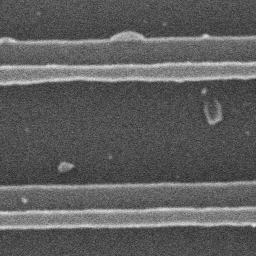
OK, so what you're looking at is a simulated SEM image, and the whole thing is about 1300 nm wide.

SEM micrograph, lines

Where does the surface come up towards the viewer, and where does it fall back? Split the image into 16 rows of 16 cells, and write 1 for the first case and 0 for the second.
0000000000000000
0000000000000000
1000001111111111
1111111111111111
1111111111111111
0000000000000000
0000000000000000
0000000000000000
0000000000000000
0000000000000000
0000000000000000
0000000001111111
1111111111111111
1111111111111111
0000000000000000
0000000000000000